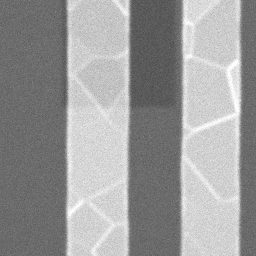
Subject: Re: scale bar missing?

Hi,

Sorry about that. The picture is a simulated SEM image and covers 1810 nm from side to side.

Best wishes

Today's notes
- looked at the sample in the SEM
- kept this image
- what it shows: wiring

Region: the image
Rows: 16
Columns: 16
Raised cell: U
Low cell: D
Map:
DDDDUUUUDDDDUUUD
DDDDUUUUDDDDUUUD
DDDDUUUUDDDUUUUD
DDDDUUUUDDDUUUUD
DDDDUUUUDDDDUUUD
DDDDUUUUDDDDUUUD
DDDDUUUUDDDDUUUD
DDDDUUUUDDDUUUUD
DDDDUUUUDDDUUUUD
DDDDUUUUDDDUUUUD
DDDDUUUUDDDUUUUD
DDDDUUUUDDDUUUUD
DDDDUUUUDDDUUUUD
DDDDUUUUDDDUUUUD
DDDDUUUUDDDUUUUD
DDDDUUUUDDDUUUUD